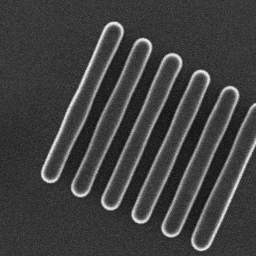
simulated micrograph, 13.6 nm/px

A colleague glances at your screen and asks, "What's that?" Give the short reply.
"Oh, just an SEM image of groups of lines, slits or small figures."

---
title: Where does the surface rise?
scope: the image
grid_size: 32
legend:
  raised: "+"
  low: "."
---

................................
................................
................................
.............++.................
.............++.................
............+++..++.............
............++..+++.............
...........+++..++..+++.........
...........++...++..+++.........
...........++..++..+++..++......
..........++...++..+++..++......
..........++..+++..++..+++..++..
.........+++..++..+++..++..+++..
.........++..+++..++..+++..++..+
........+++..++..+++..++..+++..+
........++..+++..++...++..++..++
.......+++..++..+++..++..+++..++
.......++..+++..++...++..++...++
.......++..++...++..++...++..+++
......++...++..+++..++..+++..++.
......++..+++..++..+++..++..+++.
.....+++..++..+++..++..+++..++..
......+..+++..++..+++..++..+++..
.........++..+++..++..+++..++...
.............++..+++..++..+++...
.............++..++...++..+++...
.................++..+++.+++....
.................+...++..+++....
....................+++..++.....
.....................+..+++.....
........................++......
................................